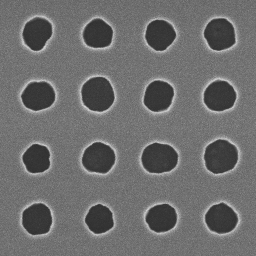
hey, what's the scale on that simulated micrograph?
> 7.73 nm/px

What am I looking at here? a regular array of holes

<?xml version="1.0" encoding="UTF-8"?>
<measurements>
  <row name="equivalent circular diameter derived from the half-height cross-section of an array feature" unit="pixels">31.1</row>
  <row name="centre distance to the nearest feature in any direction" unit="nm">466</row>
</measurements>